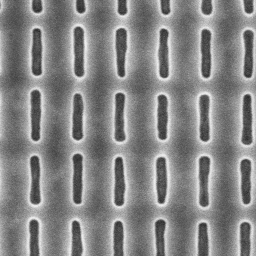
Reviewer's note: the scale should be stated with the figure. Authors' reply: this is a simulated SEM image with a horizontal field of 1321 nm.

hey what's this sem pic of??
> a regular array of holes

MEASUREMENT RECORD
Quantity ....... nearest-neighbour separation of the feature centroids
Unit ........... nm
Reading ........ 217